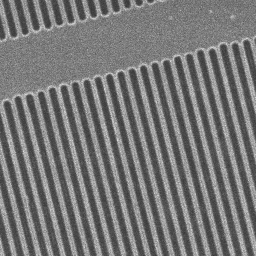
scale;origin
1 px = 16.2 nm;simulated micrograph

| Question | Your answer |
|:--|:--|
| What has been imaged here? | parallel lines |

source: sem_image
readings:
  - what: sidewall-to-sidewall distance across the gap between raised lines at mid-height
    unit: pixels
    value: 6.67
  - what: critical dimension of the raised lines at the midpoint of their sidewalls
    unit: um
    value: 0.0765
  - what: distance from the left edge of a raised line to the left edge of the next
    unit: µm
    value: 0.19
